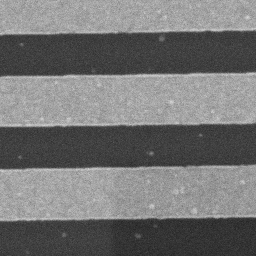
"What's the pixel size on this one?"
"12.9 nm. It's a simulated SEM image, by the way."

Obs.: lines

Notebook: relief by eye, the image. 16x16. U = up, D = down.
UUUUUUUUUUUUUUUU
UUUUUUUUUUUUUUUU
DDDDDDDDDDDDDDDD
DDDDDDDDDDDDDDDD
DDDDDDDDDDDDDDDD
UUUUUUUUUUUUUUUU
UUUUUUUUUUUUUUUU
UUUUUUUUUUUUUUUU
DDDDDDDDDDDDDDDD
DDDDDDDDDDDDDDDD
DDDDDDDDDUUUUUUU
UUUUUUUUUUUUUUUU
UUUUUUUUUUUUUUUU
UUUUUUUUUUUUUUUU
DDDDDDDDDDDDDDDD
DDDDDDDDDDDDDDDD